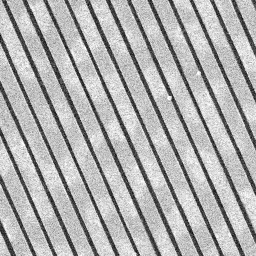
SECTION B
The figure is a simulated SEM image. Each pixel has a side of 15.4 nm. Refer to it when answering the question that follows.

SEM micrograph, parallel lines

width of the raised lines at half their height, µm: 0.218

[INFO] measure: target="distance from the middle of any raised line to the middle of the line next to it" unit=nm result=292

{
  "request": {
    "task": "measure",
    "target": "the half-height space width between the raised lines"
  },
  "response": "70.4 nm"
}